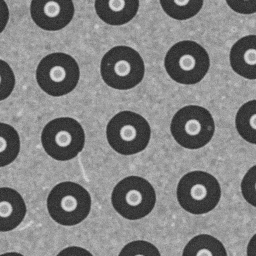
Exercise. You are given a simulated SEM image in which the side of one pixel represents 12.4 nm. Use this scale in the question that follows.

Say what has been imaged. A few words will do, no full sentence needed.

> an array of small figures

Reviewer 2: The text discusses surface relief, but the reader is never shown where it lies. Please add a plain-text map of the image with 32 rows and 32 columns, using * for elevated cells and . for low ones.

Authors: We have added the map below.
.***.....***..*..***.....***....
.***..*..***.....***.....****...
.***.....****...******.*********
.****...************************
*******************************.
**********************...****...
*************....****.....***..*
*****....****.....***..*..***..*
.****.....**...*..***.....***...
..**...*..***.....***.....****..
..***.....***....******.********
..****...***********************
*******************************.
***********************...****..
**************....****.....**...
.*****....***......**...*..**...
..***......**..**..**......***..
..***..**..**......***....*****.
...**.....****....*****..*******
..****....**********************
.*******************************
************************..*****.
***************...****.....***..
.******....***.....***..*...**..
...***.....***..*...**..*...**..
*..***..*..***.....***.....****.
*..***.....****....****...******
...****...******.***************
..******************************
************************...*****
****************...****.....***.
*.*****....****.....***..*..***.